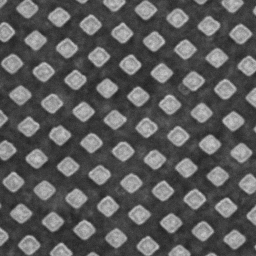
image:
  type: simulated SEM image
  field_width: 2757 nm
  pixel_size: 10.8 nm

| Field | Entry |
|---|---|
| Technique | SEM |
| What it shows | a regular array of raised bodies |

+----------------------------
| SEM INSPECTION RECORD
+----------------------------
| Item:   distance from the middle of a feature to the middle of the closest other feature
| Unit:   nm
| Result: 349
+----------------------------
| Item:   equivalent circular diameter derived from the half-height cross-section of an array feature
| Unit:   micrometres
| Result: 0.192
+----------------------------